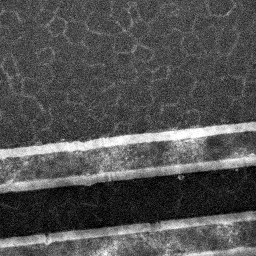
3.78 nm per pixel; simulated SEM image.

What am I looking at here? one or a few lines or trenches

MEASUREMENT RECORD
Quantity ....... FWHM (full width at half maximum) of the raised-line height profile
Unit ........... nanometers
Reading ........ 137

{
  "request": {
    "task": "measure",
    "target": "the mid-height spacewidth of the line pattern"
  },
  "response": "0.2 um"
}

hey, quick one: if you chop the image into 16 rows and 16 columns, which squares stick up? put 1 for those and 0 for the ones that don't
0000000000000000
0000000000000000
0000000000000000
0000000000000000
0000000000000000
0000000000000000
0000000000000000
0000000000000000
0000000000111111
0111111111111111
1111111111110000
1110000000000000
0000000000000000
0000000000000001
0000001111111111
1111111111111111